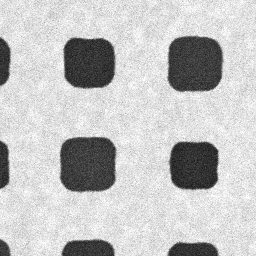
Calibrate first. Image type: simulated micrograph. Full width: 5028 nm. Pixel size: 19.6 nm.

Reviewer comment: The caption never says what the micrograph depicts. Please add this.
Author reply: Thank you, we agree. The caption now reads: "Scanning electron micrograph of holes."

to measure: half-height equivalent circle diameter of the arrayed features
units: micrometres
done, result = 1.12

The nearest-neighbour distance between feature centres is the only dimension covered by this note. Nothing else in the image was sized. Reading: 102 pixels